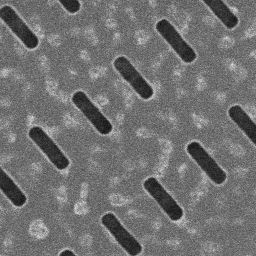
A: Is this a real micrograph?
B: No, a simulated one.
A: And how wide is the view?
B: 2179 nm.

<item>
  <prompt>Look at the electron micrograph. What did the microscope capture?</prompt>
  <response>holes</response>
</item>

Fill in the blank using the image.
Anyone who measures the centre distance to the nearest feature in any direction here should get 474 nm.